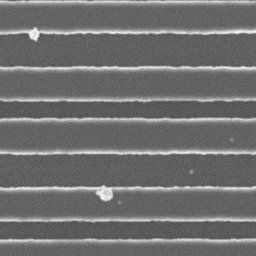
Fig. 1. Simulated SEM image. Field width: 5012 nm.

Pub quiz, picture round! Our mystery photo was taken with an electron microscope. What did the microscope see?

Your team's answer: lines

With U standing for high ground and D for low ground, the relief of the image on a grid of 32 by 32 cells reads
UUUUUUUUUUUUUUUUUUUUUUUUUUUUUUUU
UUUUUUUUUUUUUUUUUUUUUUUUUUUUUUUU
UUUUUUUUUUUUUUUUUUUUUUUUUUUUUUUU
UUUUUUUUUUUUUUUUUUUUUUUUUUUUUUUU
DDDDUDDDDDDDDDDDDDDDDDDDDDDDDDDD
DDDDDDDDDDDDDDDDDDDDDDDDDDDDDDDD
DDDDDDDDDDDDDDDDDDDDDDDDDDDDDDDD
DDDDDDDDDDDDDDDDDDDDDDDDDDDDDDDD
UUUUUUUUUUUUUUUUUUUUUUUUUUUUUUUU
UUUUUUUUUUUUUUUUUUUUUUUUUUUUUUUU
UUUUUUUUUUUUUUUUUUUUUUUUUUUUUUUU
UUUUUUUUUUUUUUUUUUUUUUUUUUUUUUUU
UUUUUUUUUUUUUUUUUUUDDDDDUUUDUDUD
DDDDDDDDDDDDDDDDDDDDDDDDDDDDDDDD
DDDDDDDDDDDDDDDDDDDDDDDDDDDDDDDD
UUUUUUUUUUUUUUUUUUUUUUUUUUUUUUUU
UUUUUUUUUUUUUUUUUUUUUUUUUUUUUUUU
UUUUUUUUUUUUUUUUUUUUUUUUUUUUUUUU
UUUUUUUUUUUUUUUUUUUUUUUUUUUUUUUU
DDDDDDDDDDDDDDDDDDDDDDDDDDDDDDDD
DDDDDDDDDDDDDDDDDDDDDDDDDDDDDDDD
DDDDDDDDDDDDDDDDDDDDDDDDDDDDDDDD
DDDDDDDDDDDDDDDDDDDDDDDDDDDDDDDD
DDUUUUUUUUUUUUUUUUUUUUUUUUUUUUUU
UUUUUUUUUUUUUUUUUUUUUUUUUUUUUUUU
UUUUUUUUUUUUUUUUUUUUUUUUUUUUUUUU
UUUUUUUUUUUUUUUUUUUUUUUUUUUUUUUU
UUUUUUUUDDUUUDUUUUUDUUUUUUUDDUUU
DDDDDDDDDDDDDDDDDDDDDDDDDDDDDDDD
DDDDDDDDDDDDDDDDDDDDDDDDDDDDDDDD
UUUUUUUUUUUUUUUUUUUUUUUUUUUUUUUU
UUUUUUUUUUUUUUUUUUUUUUUUUUUUUUUU